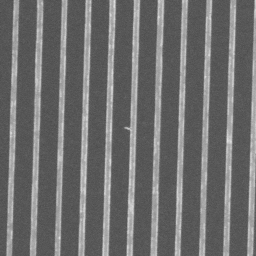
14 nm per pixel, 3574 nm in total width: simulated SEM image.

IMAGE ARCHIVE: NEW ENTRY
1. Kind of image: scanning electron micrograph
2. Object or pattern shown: parallel lines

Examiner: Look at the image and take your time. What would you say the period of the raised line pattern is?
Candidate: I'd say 336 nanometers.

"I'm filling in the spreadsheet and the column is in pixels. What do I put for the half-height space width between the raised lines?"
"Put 19.1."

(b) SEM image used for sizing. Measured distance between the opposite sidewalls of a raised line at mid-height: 69.8 nm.